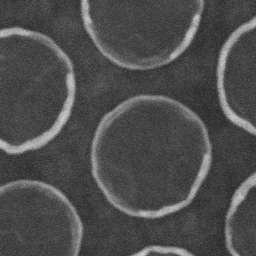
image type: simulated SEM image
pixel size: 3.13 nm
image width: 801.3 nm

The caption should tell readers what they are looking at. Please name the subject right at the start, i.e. raised bodies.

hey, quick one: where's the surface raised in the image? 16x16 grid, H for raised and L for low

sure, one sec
LLLLLHHHHHHHHLLL
LLLLLHHHHHHHLLLL
HHHLLLHHHHHHLLHH
HHHHLLLHHHHLLLHH
HHHHLLLLLLLLLLHH
HHHHHLLLLLLLLLHH
HHHHLLLLHHHLLLHH
HHHHLLLHHHHHLLHH
HHHLLLHHHHHHHLLL
LLLLLLHHHHHHHLLL
LLLLLLHHHHHHHLLL
LHHLLLHHHHHHHLLH
HHHHLLLHHHHHLLLH
HHHHHLLLLHLLLLHH
HHHHHLLLLLLLLLHH
HHHHHLLLLHHLLLHH